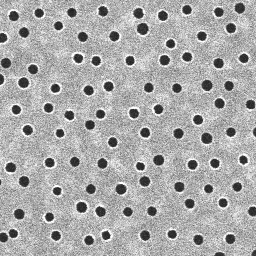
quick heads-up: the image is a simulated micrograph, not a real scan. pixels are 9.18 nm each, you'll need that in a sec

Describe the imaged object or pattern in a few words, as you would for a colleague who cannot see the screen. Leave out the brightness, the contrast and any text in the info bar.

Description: a regular array of holes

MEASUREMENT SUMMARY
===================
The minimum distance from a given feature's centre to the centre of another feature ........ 0.191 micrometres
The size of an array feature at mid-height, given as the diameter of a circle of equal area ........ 92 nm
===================